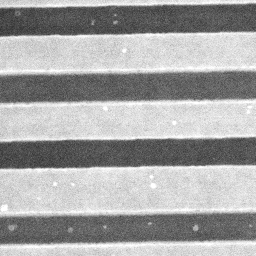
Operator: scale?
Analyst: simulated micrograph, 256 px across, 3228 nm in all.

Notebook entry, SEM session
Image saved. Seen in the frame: lines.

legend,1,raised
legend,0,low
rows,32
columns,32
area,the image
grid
11111111111111111110000000000000
00000000000000000000000000000000
00000000000000000000000000000000
00000000000000000000000000000000
00000000000001011111111111111111
11111111111111111111111111111111
11111111111111111111111111111111
11111111111111111111111111111111
11111111111111111111111111100000
00000000000000000000000000000000
00000000000000000000000000000000
00000000000000000000000000000000
00000000000000000000000000000000
11111111111111111111111111111111
11111111111111111111111111111111
11111111111111111111111111111111
11111111111111111111111111111111
11000000000000000000000000000000
00000000000000000000000000000000
00000000000000000000000000000000
00000000000000000000000000000000
11111111111111111111111111111111
11111111111111111111111111111111
11111111111111111111111111111111
11111111111111111111111111111111
11111111111111111111111111111111
11111111111110000000000000000000
00000000000000000000000000000000
00000000000000000000000000000000
00000000000000000000000000000000
00000000000000000000001111111111
11111111111111111111111111111111